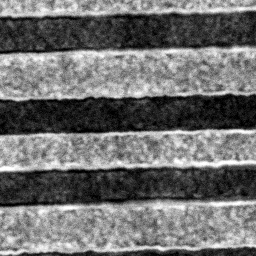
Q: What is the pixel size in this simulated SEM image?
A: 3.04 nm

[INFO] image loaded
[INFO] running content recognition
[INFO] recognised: lines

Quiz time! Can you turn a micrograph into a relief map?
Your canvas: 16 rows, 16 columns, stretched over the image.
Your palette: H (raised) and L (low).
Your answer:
HHHHHHHHHHHHHHHH
LLLLLLLLLLLLLLLL
LLLLLLLLLLLLLLLL
HHHHHHHHHHHHHHHH
HHHHHHHHHHHHHHHH
HHHHHHHHHHHHHHHH
LLLLLLLLLLLLLLLL
LLLLLLLLLLLLLLLL
HHHHHHHHHHHHHHHH
HHHHHHHHHHHHHHHH
HHHHHHLLLLLLLLLL
LLLLLLLLLLLLLLLL
LLLLLLLLLLLLLLLL
HHHHHHHHHHHHHHHH
HHHHHHHHHHHHHHHH
HHHHHHHHHHHHHLLL